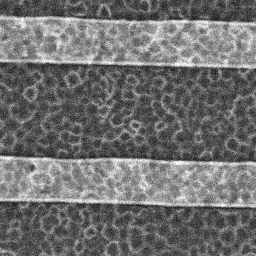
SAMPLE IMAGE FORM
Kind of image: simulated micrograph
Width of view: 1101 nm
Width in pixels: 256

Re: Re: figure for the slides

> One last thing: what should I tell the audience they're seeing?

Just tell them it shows one or a few lines or trenches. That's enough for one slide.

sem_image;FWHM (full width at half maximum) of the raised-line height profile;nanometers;183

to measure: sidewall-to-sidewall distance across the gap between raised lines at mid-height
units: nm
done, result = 417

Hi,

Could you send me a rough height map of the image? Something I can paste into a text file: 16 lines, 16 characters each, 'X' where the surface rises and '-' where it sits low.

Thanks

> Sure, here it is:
----------------
XXXXXXXXXXXXXXXX
XXXXXXXXXXXXXXXX
XXXXXXXXXXXXXXXX
----------------
----------------
----------------
----------------
----------------
----------------
XXXXXXXXXXXXXXXX
XXXXXXXXXXXXXXXX
X-XXXXXXXXXXXXXX
----------------
----------------
----------------